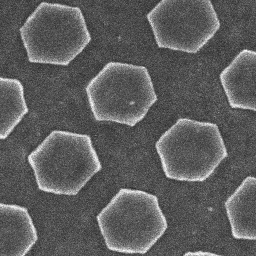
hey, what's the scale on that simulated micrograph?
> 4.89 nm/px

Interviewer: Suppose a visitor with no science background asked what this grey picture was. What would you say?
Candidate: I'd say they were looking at raised bodies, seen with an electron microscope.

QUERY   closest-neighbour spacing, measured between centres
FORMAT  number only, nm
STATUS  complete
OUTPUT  438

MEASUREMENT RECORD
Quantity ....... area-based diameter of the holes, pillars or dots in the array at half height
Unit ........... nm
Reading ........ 311